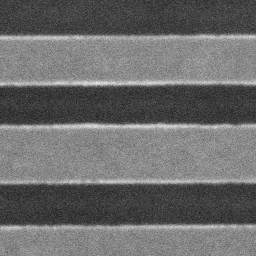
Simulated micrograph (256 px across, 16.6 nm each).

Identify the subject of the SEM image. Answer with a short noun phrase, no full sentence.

lines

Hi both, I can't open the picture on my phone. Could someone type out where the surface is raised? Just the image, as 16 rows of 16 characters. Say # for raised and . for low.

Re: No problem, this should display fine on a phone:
................
................
################
################
################
................
................
................
################
################
################
................
................
................
################
################